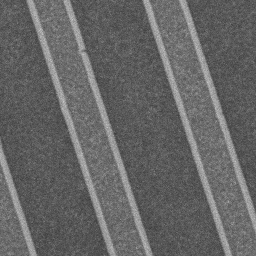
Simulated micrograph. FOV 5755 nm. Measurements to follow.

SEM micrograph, one or a few lines or trenches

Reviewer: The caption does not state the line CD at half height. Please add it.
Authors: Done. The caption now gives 769 nanometres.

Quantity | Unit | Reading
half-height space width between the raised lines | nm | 1710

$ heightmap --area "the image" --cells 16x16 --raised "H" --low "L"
LLHHLLLLLHHHLLLL
LLHHHLLLLLHHLLLL
LLLHHLLLLLHHLLLL
LLLHHLLLLLHHHLLL
LLLHHHLLLLLHHLLL
LLLLHHLLLLLHHLLL
LLLLHHLLLLLHHHLL
LLLLHHHLLLLLHHLL
LLLLLHHLLLLLHHLL
LLLLLHHLLLLLHHHL
LLLLLHHHLLLLLHHL
HLLLLLHHLLLLLHHL
HLLLLLHHLLLLLHHH
HLLLLLHHHLLLLLHH
HHLLLLLHHLLLLLHH
HHLLLLLHHLLLLLHH